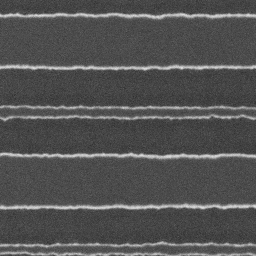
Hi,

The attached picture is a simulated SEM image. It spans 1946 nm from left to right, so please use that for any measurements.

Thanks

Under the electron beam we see lines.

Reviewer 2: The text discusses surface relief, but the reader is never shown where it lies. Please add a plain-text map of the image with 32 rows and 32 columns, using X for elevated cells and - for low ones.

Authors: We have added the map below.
--------------------------------
--------------------------------
XXXXXXXXXXXXXXXXXXXXXXXXXXXXXXXX
XXXXXXXXXXXXXXXXXXXXXXXXXXXXXXXX
XXXXXXXXXXXXXXXXXXXXXXXXXXXXXXXX
XXXXXXXXXXXXXXXXXXXXXXXXXXXXXXXX
XXXXXXXXXXXXXXXXXXXXXXXXXXXXXXXX
XXXXXXXXXXXXXXXXXXXXXXXXXXXXXXXX
----X-XXX-X-XXX-XXX-X-----------
--------------------------------
--------------------------------
--------------------------------
--------------------------------
XXXXXXXXXXXXXXXX-XXXXXXXX-XXX-X-
XXXXXXXXXXXXXXXXXXXXXXXXXXXXXXXX
--------------------------------
--------------------------------
--------------------------------
--------------------------------
XXXXXXXXXXXXXXXXXXX--XXXXXXXXXXX
XXXXXXXXXXXXXXXXXXXXXXXXXXXXXXXX
XXXXXXXXXXXXXXXXXXXXXXXXXXXXXXXX
XXXXXXXXXXXXXXXXXXXXXXXXXXXXXXXX
XXXXXXXXXXXXXXXXXXXXXXXXXXXXXXXX
XXXXXXXXXXXXXXXXXXXXXXXXXXXXXXXX
XXXXXXXXXXXXXXXXXXXXXXXXXXXXXXXX
--------------------------------
--------------------------------
--------------------------------
--------------------------------
-------------------XX-----X-----
XXXXXXXXXXXXXXXXXXXXXXXXXXXXXXXX